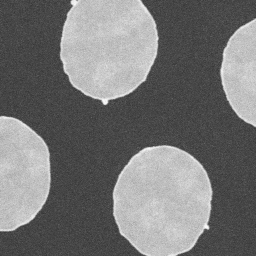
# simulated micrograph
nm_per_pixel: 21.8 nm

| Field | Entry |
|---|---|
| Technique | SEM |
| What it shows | raised bodies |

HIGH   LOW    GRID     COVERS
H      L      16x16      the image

LLLLHHHHHLLLLLLL
LLLLHHHHHHLLLLLL
LLLLHHHHHHLLLLHH
LLLLHHHHHHLLLLHH
LLLLHHHHHLLLLLHH
LLLLLHHHLLLLLLHH
LLLLLLLLLLLLLLHH
LLLLLLLLLLLLLLLH
HHLLLLLLLLLLLLLL
HHHLLLLLLHHLLLLL
HHHLLLLLHHHHHLLL
HHHLLLLHHHHHHLLL
HHHLLLLHHHHHHLLL
HLLLLLLHHHHHHLLL
LLLLLLLLHHHHHLLL
LLLLLLLLLHHHLLLL